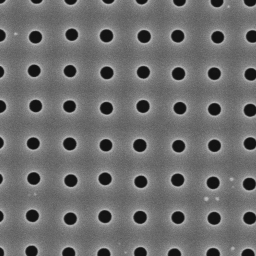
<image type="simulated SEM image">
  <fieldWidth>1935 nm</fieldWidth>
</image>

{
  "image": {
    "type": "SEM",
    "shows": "a regular array of holes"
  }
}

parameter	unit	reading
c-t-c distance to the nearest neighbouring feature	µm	0.262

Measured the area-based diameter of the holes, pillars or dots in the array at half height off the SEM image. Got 97.7 nanometres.